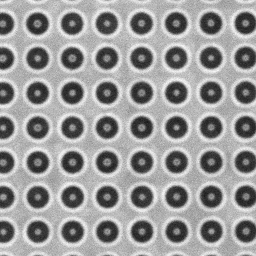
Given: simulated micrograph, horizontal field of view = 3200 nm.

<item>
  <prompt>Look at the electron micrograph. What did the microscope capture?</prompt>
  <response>an array of small figures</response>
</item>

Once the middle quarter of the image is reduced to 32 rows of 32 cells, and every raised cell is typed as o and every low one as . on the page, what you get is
.....ooo.....oooo.....ooo......o
o..oooooo...oooooo...oooooo..ooo
oooooooooooooooooooooooooooooooo
oooooooooooooooooooooooooooooooo
....ooooo....ooooo...ooooo....oo
.....ooo.....oooo.....ooo......o
.....ooo......oo.......oo......o
..o..oo...o...oo...o...oo......o
.....ooo......oo......ooo......o
....oooo.....oooo.....oooo....oo
oo.ooooooo.oooooooo.ooooooo..ooo
oooooooooooooooooooooooooooooooo
oooooooooooooooooooooooooooooooo
....ooooo....oooo.....oooo....oo
.....ooo......oo......ooo......o
.....ooo..o...oo...o...oo......o
.....ooo......oo.......oo......o
.....ooo......ooo.....ooo......o
....ooooo....ooooo...ooooo....oo
oooooooooooooooooooooooooooooooo
oooooooooooooooooooooooooooooooo
o..ooooooo..ooooooo.ooooooo..ooo
.....ooo.....oooo.....oooo.....o
.....ooo......oo.......oo......o
..o..ooo..oo..oo...o...oo..oo...
.....ooo......oo.......oo......o
.....ooo......ooo.....oooo.....o
o...oooooo..oooooo...oooooo..ooo
oooooooooooooooooooooooooooooooo
oooooooooooooooooooooooooooooooo
o...ooooo....ooooo...ooooo....oo
.....ooo......ooo.....ooo......o